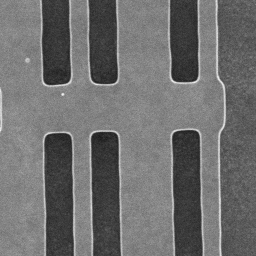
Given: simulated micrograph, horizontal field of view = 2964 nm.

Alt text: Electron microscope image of groups of lines, slits or small figures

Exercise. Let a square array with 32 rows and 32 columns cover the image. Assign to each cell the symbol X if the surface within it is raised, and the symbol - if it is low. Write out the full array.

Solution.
XXXXX----XX----XXXXXX----XX-----
XXXXX----XX----XXXXXX----XX-----
XXXXX----XX----XXXXXX----XX-----
XXXXX----XX----XXXXXX----XX-----
XXXXX----XX----XXXXXX----XX-----
XXXXX----XX----XXXXXX----XX-----
XXXXX----XX----XXXXXX----XX-----
XXXXX----XX----XXXXXX----XX-----
XXXXX----XX----XXXXXX----XX-----
XXXXX----XX----XXXXXX----XX-----
XXXXXX--XXXX--XXXXXXXXXXXXXX----
XXXXXXXXXXXXXXXXXXXXXXXXXXXX----
XXXXXXXXXXXXXXXXXXXXXXXXXXXX----
XXXXXXXXXXXXXXXXXXXXXXXXXXXX----
XXXXXXXXXXXXXXXXXXXXXXXXXXXX----
XXXXXXXXXXXXXXXXXXXXXXXXXXXX----
XXXXXXXXXXXX--XXXXXXXX---XXX----
XXXXXX---XX----XXXXXX----XX-----
XXXXX----XX----XXXXXXX---XX-----
XXXXX----XX----XXXXXXX---XX-----
XXXXX----XX----XXXXXXX---XX-----
XXXXX----XX----XXXXXXX---XX-----
XXXXX----XX----XXXXXXX---XX-----
XXXXXX---XX----XXXXXXX---XX-----
XXXXXX---XX----XXXXXXX---XX-----
XXXXXX---XX----XXXXXXX---XX-----
XXXXXX---XX----XXXXXXX---XX-----
XXXXXX---XX----XXXXXXX---XX-----
XXXXXX---XXX---XXXXXXX---XX-----
XXXXXX---XXX---XXXXXXX---XX-----
XXXXXX---XXX---XXXXXXX---XX-----
XXXXXX---XXX---XXXXXXX---XXX----